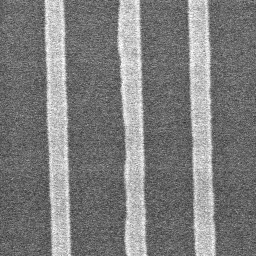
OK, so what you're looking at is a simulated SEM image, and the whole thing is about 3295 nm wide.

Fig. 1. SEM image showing one or a few lines or trenches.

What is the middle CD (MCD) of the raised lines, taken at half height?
206 nm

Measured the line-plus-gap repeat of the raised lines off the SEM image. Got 925 nm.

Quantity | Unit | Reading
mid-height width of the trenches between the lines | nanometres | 700